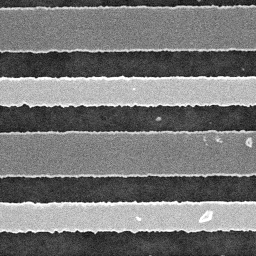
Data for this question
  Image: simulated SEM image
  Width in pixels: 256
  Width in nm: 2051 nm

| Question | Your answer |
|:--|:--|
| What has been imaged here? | lines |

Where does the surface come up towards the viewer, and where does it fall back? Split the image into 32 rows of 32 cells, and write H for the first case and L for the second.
LLLLLLLLLLLLLLLLLLLLLLLLLLLLLLLL
HHHHHHHHHHHHHHHHHHHHHHHHHHHHHHHH
HHHHHHHHHHHHHHHHHHHHHHHHHHHHHHHH
HHHHHHHHHHHHHHHHHHHHHHHHHHHHHHHH
HHHHHHHHHHHHHHHHHHHHHHHHHHHHHHHH
HHHHHHHHHHHHHHHHHHHHHHHHHHHHHHHH
LLLLHHLLLLLLLLLLLLLLLLLLLLLLLLLL
LLLLLLLLLLLLLLLLLLLLLLLLLLLLLLLL
LLLLLLLLLLLLLLLLLLLLLLLLLLLLLLLL
LLLLLLLLLLLLLLLLLLLLLLLLLLLLLLLL
HHHHHHHHHHHHHHHHHHHHHHHHHHHHHHHH
HHHHHHHHHHHHHHHHHHHHHHHHHHHHHHHH
HHHHHHHHHHHHHHHHHHHHHHHHHHHHHHHH
LLLLLLLLLLLLLLLLLLLLLLLLLLLLLLLL
LLLLLLLLLLLLLLLLLLLLLLLLLLLLLLLL
LLLLLLLLLLLLLLLLLLLLLLLLLLLLLLLL
LLLLLLHLHHLLLLHHLLHHHHHHHHHHHHHH
HHHHHHHHHHHHHHHHHHHHHHHHHHHHHHHH
HHHHHHHHHHHHHHHHHHHHHHHHHHHHHHHH
HHHHHHHHHHHHHHHHHHHHHHHHHHHHHHHH
HHHHHHHHHHHHHHHHHHHHHHHHHHHHHHHH
HHHHHHHHHHHHHHHHHHHHHHHHHHHHHHHH
LLLLLLLLLLLLLLLLLLLLLLLLLLLLLLLL
LLLLLLLLLLLLLLLLLLLLLLLLLLLLLLLL
LLLLLLLLLLLLLLLLLLLLLLLLLLLLLLLL
HHHHHLHHHHHHHHHHHHHHHHHHHHHHHHHH
HHHHHHHHHHHHHHHHHHHHHHHHHHHHHHHH
HHHHHHHHHHHHHHHHHHHHHHHHHHHHHHHH
HHHHHHHHHHHHHHHHHHHHHHHHHHHHHHHH
LLLLLLLLLLLLLLLLLLLLLLLLLLLLLLLL
LLLLLLLLLLLLLLLLLLLLLLLLLLLLLLLL
LLLLLLLLLLLLLLLLLLLLLLLLLLLLLLLL